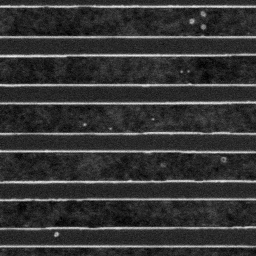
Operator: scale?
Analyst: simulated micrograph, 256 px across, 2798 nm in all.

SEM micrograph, lines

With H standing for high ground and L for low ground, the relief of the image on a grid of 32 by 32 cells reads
HHHHHHHHHHHHHHHHHHHHHHHHHHHHHHHH
LLLLLLLLLLLLLLLLLLLLLLLLLLLLLLLL
LLLLLLLLLLLLLLLLLLLLLLLLLLLLLLLL
LLLLLLLLLLLLLLLLLLLLLLLLLLLLLLLL
LLLLLLLLLLLLLLLLLLLLLLLLLLLLLLLL
HHHHHHHHHHHHHHHHHHHHHHHHHHHHHHHH
HHHHHHHHHHHHHHHHHHHHHHHHHHHHHHHH
LLLLLLLLLLLLLLLLLLLLLLLLLLLLLLLL
LLLLLLLLLLLLLLLLLLLLLLLLLLLLLLLL
LLLLLLLLLLLLLLLLLLLLLLLLLLLLLLLL
LLLLLLLLLLLLLLLLLLLLLLLLLLLLLLLL
HHHHHHHHHHHHHHHHHHHHHHHHHHHHHHHH
HHHHHHHHHHHHHHHHHHHHHHHHHHHHHHHH
LLLLLLLLLLLLLLLLLLLLLLLLLLLLLLLL
LLLLLLLLLLLLLLLLLLLLLLLLLLLLLLLL
LLLLLLLLLLLLLLLLLLLLLLLLLLLLLLLL
LLLLLLLLLLLLLLLLLLLLLLLLLLLLLLLL
HHHHHHHHHHHHHHHHHHHHHHHHHHHHHHHH
HHHHHHHHHHHHHHHHHHHHHHHHHHHHHHHH
LLLLLLLLLLLLLLLLLLLLLLLLLLLLLLLL
LLLLLLLLLLLLLLLLLLLLLLLLLLLLLLLL
LLLLLLLLLLLLLLLLLLLLLLLLLLLLLLLL
LLLLLLLLLLLLLLLLLLLLLLLLLLLLLLLL
HHHHHHHHHHHHHHHHHHHHHHHHHHHHHHHH
HHHHHHHHHHHHHHHHHHHHHHHHHHHHHHHH
LLLLLLLLLLLLLLLLLLLLLLLLLLLLLLLL
LLLLLLLLLLLLLLLLLLLLLLLLLLLLLLLL
LLLLLLLLLLLLLLLLLLLLLLLLLLLLLLLL
LLLLLLHHHHLLLHHHHHHHHHHHHHHHHHHH
HHHHHHHHHHHHHHHHHHHHHHHHHHHHHHHH
HHHHHHHHHHHHHHHHHHHHHHHHHHHHHHHH
LLLLLLLLLLLLLLLLLLLLLLLLLLLLLLLL